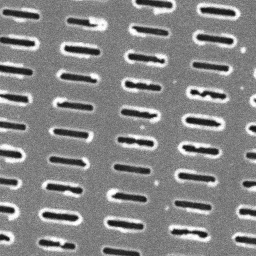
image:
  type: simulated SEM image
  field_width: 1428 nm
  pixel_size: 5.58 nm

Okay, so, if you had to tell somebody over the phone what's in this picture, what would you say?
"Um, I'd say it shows a regular array of holes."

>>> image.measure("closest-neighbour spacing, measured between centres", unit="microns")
0.155